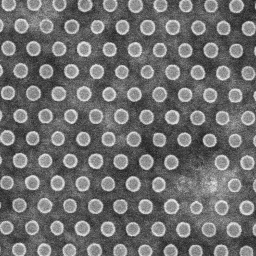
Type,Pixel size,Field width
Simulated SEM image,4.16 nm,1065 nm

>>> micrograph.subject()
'a regular array of raised bodies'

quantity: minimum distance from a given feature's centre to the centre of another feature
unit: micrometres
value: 0.104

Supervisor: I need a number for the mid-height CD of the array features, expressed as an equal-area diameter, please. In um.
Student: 0.0557